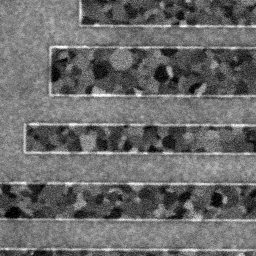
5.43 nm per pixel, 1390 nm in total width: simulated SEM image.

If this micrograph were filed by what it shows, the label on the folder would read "one or a few lines or trenches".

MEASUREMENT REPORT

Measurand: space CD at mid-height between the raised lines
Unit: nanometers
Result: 157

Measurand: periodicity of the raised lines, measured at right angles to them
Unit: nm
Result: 351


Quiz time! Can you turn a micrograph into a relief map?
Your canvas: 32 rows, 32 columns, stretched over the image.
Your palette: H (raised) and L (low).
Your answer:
LLLLLLLLLLHHHHHHHHHHHHHHHHHHHHHH
LLLLLLLLLLHHHHHHHHHHHHHHHHHHHHHH
LLLLLLLLLLHHHHHHHHHHHHHHHHHHHHHH
LLLLLLHLLLLLLLLLLLLLLLLLLLLLLLLL
LLLLLLLLLLLLLHLLLLLLLLLLLLLLLLLL
LLLLLLLLLLLLLLLLLLLLLLLLLLLLLLLL
LLLLLLHHHHHHHHHHHHHHHHHHHHHHHHHH
LLLLLLHHHHHHHHHHHHHHHHHHHHHHHHHH
LLLLLLHHHHHHHHHHHHHHHHHHHHHHHHHH
LLLLLLHHHHHHHHHHHHHHHHHHHHHHHHHH
LLLLLLHHHHHHHHHHHHHHHHHHHHHHHHHH
LLLLLLHHHHHHHHHHHHHHHHHHHHHHHHHH
LLLLLLLLLLLLLLLLLLLLLLLLLLLLLLLL
LLLLLLLLLLLLLLLLLLLLLLLLLLLLLLLL
LLLLLLLLLLLLLLLLLLLLLLLLLLLLLLLL
LLLLHHLLLHLLLLLLLLLLLLLLLLLLLLLL
LLLHHHHHHHHHHHHHHHHHHHHHHHHHHHHH
LLLHHHHHHHHHHHHHHHHHHHHHHHHHHHHH
LLLHHHHHHHHHHHHHHHHHHHHHHHHHHHHH
LLLLLLLLLLLLLLLLLLLLLLLLLLLLLLLL
LLLLLLLLLLLLLLLLLLLLLLLLLLLLLLLL
LLLLLLLLLLLLLLLLLLLLLLLLLLLLLLLL
LLLLLLLLLLLLLLLLLLLLLLLLLLLLLLLL
HHHHHHHHHHHHHHHHHHHHHHHHHHHHHHHH
HHHHHHHHHHHHHHHHHHHHHHHHHHHHHHHH
HHHHHHHHHHHHHHHHHHHHHHHHHHHHHHHH
HHHHHHHHHHHHHHHHHHHHHHHHHHHHHHHH
LLLLLLLLLLLLLLLHHLLLHHHHHHHHHHHH
LLLLLLLLLLLLLLLLLLLLLLLLLLLLLLLL
LLLLLLLLLLLLLLLLLLLLLLLLLLLLLLLL
LLLLLLLLLLLLHLLLLLLLLLLLLLLLLLLL
HHHHHHHHHHHHHHHHHHHHHHHHHHHHHHHH